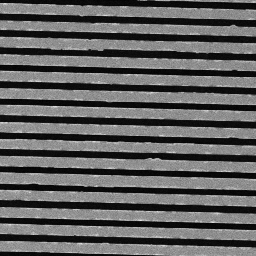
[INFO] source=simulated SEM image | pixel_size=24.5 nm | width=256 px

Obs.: parallel lines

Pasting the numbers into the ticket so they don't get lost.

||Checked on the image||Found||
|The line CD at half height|254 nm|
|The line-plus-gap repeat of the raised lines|0.416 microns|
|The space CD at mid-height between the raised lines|168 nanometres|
